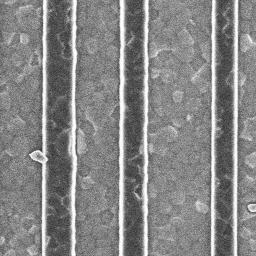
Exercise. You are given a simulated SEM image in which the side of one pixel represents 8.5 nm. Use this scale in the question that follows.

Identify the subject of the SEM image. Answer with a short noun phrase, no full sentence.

one or a few lines or trenches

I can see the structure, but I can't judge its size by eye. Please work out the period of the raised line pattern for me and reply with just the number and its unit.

704 nm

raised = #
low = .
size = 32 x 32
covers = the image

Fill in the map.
.....####......###.........###..
......###......###.........###..
......###......###.........###..
......###......###.........###..
.....####......###.........###..
.....####......###.........###..
......###......###.........###..
.....####......###.........###..
.....####......###.........###..
......###......###.........###..
......###......###.........###..
......###......###.........###..
.....####......###.........###..
.....####......###.........###..
.....####......###.........###..
......###......###.........###..
......###......###.........###..
......###......###.........###..
.....####......###.........###..
....#####......###.........###..
.....####......###.........###..
.....####......###.........###..
.....####......###.........##...
.....####......###.........##...
.....####......###.........##...
.....####......###........###...
.....####......###........###...
.....####......###.........##...
.....####......###.........##...
.....####......###.........##...
.....####......###........###...
.....####......###.........##...